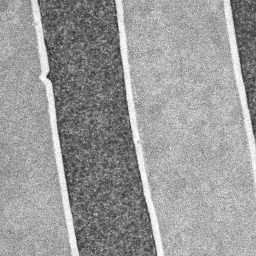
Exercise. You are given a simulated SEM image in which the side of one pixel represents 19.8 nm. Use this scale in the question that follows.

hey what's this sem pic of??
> one or a few lines or trenches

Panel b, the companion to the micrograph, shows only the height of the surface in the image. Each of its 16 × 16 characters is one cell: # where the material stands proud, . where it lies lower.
##.....#######..
##......######..
###.....#######.
###.....#######.
###.....#######.
###.....#######.
###.....#######.
###.....#######.
###......#######
####.....#######
####.....#######
####.....#######
####.....#######
####......######
####......######
#####.....######